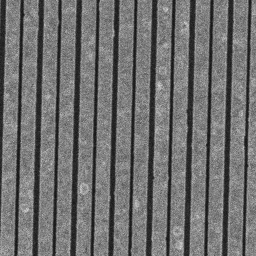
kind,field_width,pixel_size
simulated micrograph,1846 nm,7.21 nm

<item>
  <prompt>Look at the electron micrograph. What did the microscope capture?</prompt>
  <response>parallel lines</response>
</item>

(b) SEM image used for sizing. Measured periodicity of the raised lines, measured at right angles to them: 137 nanometers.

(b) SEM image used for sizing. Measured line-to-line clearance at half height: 31.5 nm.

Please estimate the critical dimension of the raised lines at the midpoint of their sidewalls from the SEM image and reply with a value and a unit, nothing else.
101 nanometers